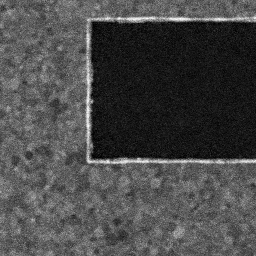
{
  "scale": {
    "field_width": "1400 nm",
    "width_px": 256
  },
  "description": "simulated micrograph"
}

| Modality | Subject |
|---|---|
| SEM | one or a few lines or trenches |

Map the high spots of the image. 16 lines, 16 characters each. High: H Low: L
HHHHHHHHHHHHHHHH
HHHHHHLLLLLLLLLL
HHHHHLLLLLLLLLLL
HHHHHLLLLLLLLLLL
HHHHHHLLLLLLLLLL
HHHHHHLLLLLLLLLL
HHHHHLLLLLLLLLLL
HHHHHLLLLLLLLLLL
HHHHHLLLLLLLLLLL
HHHHHHLLLLLLLLLL
HHHHHHHHHHHHHHHH
HHHHHHHHHHHHHHHH
HHHHHHHHHHHHHHHH
HHHHHHHHHHHHHHHH
HHHHHHHHHHHHHHHH
HHHHHHHHHHHHHHHH